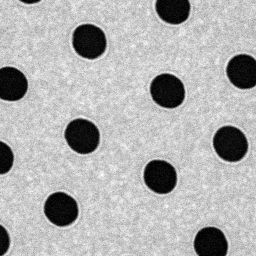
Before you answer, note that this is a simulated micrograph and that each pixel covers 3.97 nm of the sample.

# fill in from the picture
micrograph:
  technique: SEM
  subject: holes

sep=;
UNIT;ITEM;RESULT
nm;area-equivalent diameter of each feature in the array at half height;143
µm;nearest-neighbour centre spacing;0.307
